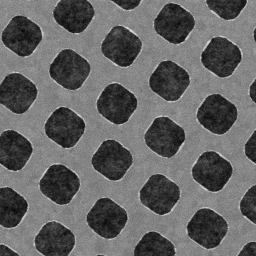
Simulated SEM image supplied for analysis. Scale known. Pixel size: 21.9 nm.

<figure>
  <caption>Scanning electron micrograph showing a regular array of holes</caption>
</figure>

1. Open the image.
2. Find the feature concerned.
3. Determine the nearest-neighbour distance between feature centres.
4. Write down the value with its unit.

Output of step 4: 1.25 um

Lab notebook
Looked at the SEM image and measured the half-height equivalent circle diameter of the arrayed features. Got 0.862 micrometres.